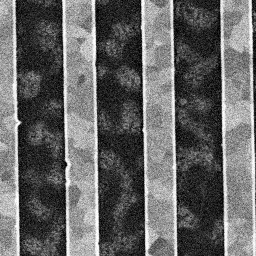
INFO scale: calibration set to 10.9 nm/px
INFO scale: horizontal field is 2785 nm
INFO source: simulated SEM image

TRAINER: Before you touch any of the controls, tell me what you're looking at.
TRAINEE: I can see one or a few lines or trenches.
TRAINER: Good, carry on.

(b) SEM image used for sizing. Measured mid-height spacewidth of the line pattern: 0.541 microns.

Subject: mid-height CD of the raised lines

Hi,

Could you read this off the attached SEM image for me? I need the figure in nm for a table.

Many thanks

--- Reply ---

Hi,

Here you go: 317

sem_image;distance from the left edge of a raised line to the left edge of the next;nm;856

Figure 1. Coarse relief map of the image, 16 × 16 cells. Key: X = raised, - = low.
X---XX---XX---XX
X---XX---XX---XX
X---XX---XX---XX
X---XX---XX---XX
X---XX---XX---XX
X---XX---XX---XX
X---XX---XX---XX
X---XX---XX---XX
X---XX---XX---XX
X---XX---XX---XX
X---XX---XX---XX
X---XX---XX---XX
X---XX---XX---XX
X---XX---XX---XX
X---XX---XX---XX
X---XX---XX---XX